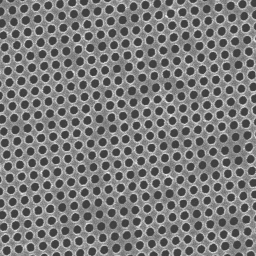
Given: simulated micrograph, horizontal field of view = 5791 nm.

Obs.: a regular array of holes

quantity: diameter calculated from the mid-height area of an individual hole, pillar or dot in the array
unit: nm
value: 193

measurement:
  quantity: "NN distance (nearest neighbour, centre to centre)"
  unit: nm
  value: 265